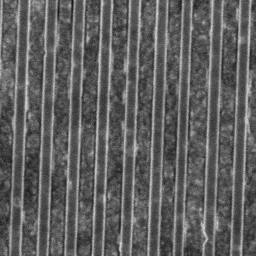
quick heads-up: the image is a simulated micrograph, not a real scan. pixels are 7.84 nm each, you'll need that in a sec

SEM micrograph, parallel lines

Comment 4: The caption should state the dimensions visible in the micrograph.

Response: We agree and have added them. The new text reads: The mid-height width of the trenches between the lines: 129 nm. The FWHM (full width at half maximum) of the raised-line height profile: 11.2 pixels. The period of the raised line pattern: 216 nanometres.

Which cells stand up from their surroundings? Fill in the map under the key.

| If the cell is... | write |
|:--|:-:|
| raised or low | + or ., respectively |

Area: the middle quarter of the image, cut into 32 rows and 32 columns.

..++.....++.....++.....++....++.
..++.....++.....++.....++....++.
..+++....++.....++.....++....++.
..++.....++.....++.....++....++.
..++.....++.....++.....++....++.
..++.....++.....++.....++....++.
..++.....++.....++.....++....++.
..++.....++.....++....+++....++.
..++.....++....+++....+++....++.
..++.....++....+++....+++....++.
..++....+++....+++....+++....++.
.+++....+++....+++....+++....++.
.+++....+++....+++....+++....++.
.+++....+++....+++....+++....++.
.+++....+++....+++....+++....++.
.+++....+++....+++....+++....++.
.+++....+++....+++....+++...+++.
.+++....+++....+++....+++...+++.
.+++....+++....+++....+++...+++.
.+++....+++....+++....+++...+++.
.+++....+++....+++....+++...+++.
.+++....+++....+++....+++...+++.
.+++....+++....+++....+++...+++.
.+++....+++....+++....++....+++.
.+++....+++....+++....++....+++.
.+++....+++....++.....++....++..
.+++....++.....++.....++....++..
.+++....++.....++.....++....++..
.+++....++.....++.....++....++..
.++.....++.....++.....++....++..
.++.....++.....++.....++....++..
.++.....++.....++.....++....++..